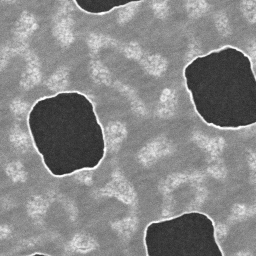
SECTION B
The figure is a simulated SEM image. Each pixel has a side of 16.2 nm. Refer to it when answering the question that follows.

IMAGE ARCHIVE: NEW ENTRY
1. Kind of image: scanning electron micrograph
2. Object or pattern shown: holes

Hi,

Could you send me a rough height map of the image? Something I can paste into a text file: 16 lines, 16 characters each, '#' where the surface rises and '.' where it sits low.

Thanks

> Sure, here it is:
#####..#########
################
################
#############..#
############....
############....
##....######....
##....#######...
##....##########
##....##########
###..###########
################
################
###########..###
#########....###
#########.....##